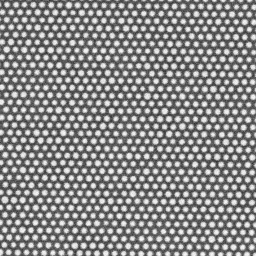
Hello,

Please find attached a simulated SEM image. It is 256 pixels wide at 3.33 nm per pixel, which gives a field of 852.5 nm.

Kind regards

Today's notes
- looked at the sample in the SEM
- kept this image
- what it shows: a regular array of raised bodies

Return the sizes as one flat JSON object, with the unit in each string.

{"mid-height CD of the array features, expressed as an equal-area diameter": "0.018 microns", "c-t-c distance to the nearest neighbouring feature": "27.5 nm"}